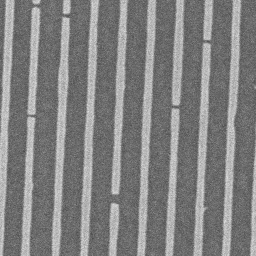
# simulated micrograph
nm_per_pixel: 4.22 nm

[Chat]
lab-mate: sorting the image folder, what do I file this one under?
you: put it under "parallel lines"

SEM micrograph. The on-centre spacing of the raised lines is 0.12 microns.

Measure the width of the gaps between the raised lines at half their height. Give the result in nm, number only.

90.1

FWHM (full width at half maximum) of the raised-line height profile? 30 nm